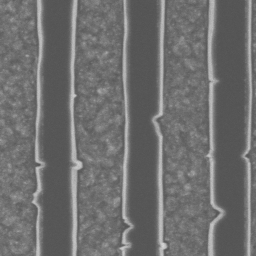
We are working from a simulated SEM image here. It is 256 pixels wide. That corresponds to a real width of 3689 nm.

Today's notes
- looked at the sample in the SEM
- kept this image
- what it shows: one or a few lines or trenches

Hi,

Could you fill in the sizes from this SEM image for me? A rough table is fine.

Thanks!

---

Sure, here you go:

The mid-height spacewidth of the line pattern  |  0.729 um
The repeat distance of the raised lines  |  1.26 um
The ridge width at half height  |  528 nanometers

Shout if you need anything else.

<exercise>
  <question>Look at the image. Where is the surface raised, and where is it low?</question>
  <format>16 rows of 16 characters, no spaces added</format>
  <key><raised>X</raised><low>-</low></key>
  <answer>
--XXX---XX---XXX
--XXX---XX---XXX
---XX---XX---XXX
---XX---XX---XXX
--XXX---XX---XXX
--XXX---XX---XXX
--XXX---XX---XXX
--XX----XX---XXX
--XXX---XX---XXX
--XXX---XX---XX-
--XXX---XX---XXX
--XXX---XX---XXX
--XXX---XX---XXX
--XXX---XX----XX
--XXX---XX---XXX
--XXX---XX---XXX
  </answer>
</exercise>